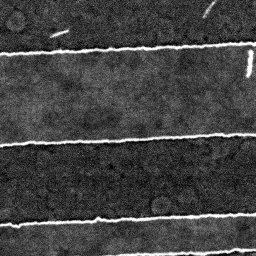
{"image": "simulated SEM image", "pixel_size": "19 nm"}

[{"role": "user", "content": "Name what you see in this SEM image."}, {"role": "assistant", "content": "one or a few lines or trenches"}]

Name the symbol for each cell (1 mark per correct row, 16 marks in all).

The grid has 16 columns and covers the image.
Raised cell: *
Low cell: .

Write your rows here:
................
................
................
****************
****************
****************
****************
****************
*************...
................
................
................
................
..........*..***
****************
****************